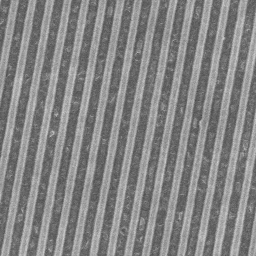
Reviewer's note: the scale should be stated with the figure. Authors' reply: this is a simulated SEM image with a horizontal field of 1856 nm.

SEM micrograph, parallel lines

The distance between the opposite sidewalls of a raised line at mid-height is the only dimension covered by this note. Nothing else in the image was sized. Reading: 46.4 nanometres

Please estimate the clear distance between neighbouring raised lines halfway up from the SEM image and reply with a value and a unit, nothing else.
0.0803 micrometres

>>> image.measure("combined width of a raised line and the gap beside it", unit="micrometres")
0.126